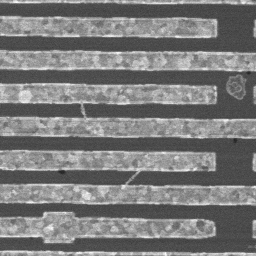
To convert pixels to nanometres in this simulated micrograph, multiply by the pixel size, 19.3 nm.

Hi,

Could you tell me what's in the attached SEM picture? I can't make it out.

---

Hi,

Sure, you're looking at wiring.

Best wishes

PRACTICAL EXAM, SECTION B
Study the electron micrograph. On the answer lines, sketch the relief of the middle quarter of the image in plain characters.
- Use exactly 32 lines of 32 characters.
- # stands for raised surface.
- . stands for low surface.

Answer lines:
################################
................................
................................
................................
................................
###.............................
################################
################################
################################
....#.......#####..........#####
................................
................................
................................
................................
################################
################################
################################
################################
................................
................................
................................
................................
################################
################################
################################
################################
................................
................................
................................
................................
####...........#................
################################